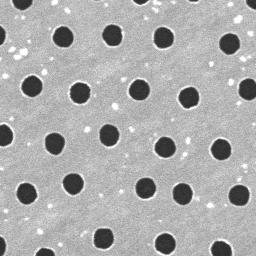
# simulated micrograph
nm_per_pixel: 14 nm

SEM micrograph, a regular array of holes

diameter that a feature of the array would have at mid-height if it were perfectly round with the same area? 300 nm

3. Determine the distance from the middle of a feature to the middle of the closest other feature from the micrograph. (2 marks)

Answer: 689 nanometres